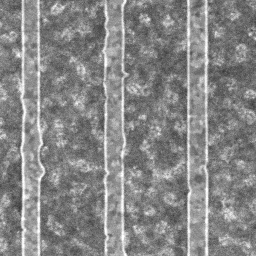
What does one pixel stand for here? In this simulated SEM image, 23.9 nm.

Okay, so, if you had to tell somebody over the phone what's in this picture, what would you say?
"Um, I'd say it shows one or a few lines or trenches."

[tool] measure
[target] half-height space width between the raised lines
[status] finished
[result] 1580 nm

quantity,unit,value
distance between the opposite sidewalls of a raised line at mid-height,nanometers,403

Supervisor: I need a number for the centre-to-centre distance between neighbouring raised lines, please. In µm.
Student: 1.98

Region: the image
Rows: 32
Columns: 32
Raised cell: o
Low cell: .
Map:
...oo........oo.........oo......
...oo........oo.........oo......
...oo........oo.........oo......
...oo........oo.........oo......
...oo........oo.........oo......
...oo........oo.........oo......
...oo........oo.........oo......
...oo........oo.........oo......
...oo........oo.........oo......
...oo........ooo........oo......
...oo........oo.........oo......
...oo........oo.........oo......
...oo........oo.........oo......
...oo........oo.........oo......
...oo........oo.........oo......
...oo........oo.........oo......
...oo........oo.........oo......
...oo........ooo........oo......
...oo........oo.........oo......
...oo........oo.........oo......
...oo........oo.........oo......
...oo........oo.........oo......
...oo........oo.........oo......
...oo........oo.........oo......
...oo........oo.........oo......
...oo........oo.........oo......
...oo........oo.........oo......
...oo........oo.........oo......
...oo........oo.........oo......
...oo........oo.........oo......
...oo........oo.........oo......
...oo........ooo........oo......